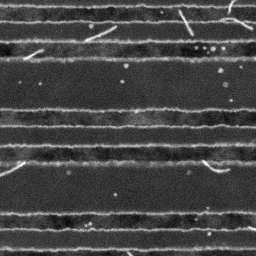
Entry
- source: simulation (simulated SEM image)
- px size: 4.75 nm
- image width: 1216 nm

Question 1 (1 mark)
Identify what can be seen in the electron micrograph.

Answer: lines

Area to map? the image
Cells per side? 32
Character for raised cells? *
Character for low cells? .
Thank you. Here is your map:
********************************
................................
................................
********************************
********************************
................................
................................
********************************
********************************
********************************
********************************
********************************
********************************
********************************
................................
................................
********************************
********************************
................................
................................
..*********.*****....***********
********************************
********************************
********************************
********************************
********************************
********************************
................................
...............................*
********************************
********************************
................................